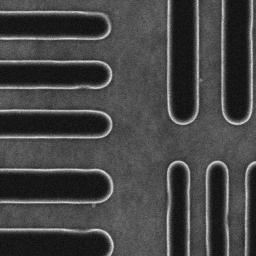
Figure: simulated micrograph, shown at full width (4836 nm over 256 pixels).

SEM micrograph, groups of lines, slits or small figures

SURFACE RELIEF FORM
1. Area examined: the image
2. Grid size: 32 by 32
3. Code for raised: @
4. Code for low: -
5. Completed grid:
---------------------@@@@---@@@-
@@@@@@@@@@-----------@@@@---@@@-
@@@@@@@@@@@@@@-------@@@@---@@@-
@@@@@@@@@@@@@@-------@@@@---@@@-
@@@@@@@@@@@@@--------@@@@---@@@-
---------------------@@@@---@@@-
---------------------@@@@---@@@-
---------------------@@@@---@@@-
@@@@@@@@@@@@@@-------@@@@---@@@-
@@@@@@@@@@@@@@-------@@@@---@@@-
@@@@@@@@@@@@@--------@@@@---@@@-
---------------------@@@@---@@@-
---------------------@@@@---@@@-
---------------------@@@@---@@@-
@@@@@@@@@@@@@--------@@@@---@@@-
@@@@@@@@@@@@@@------------------
@@@@@@@@@@@@@@------------------
--------------------------------
--------------------------------
--------------------------------
----------------------@---@@---@
@@@@@@@@@@@@@--------@@@--@@---@
@@@@@@@@@@@@@@-------@@@--@@---@
@@@@@@@@@@@@@@-------@@@--@@---@
@@@@@@@@@@@@@@-------@@@--@@---@
---------------------@@@--@@---@
---------------------@@@--@@---@
---------------------@@@--@@---@
---------------------@@@--@@---@
@@@@@@@@@@@@@@-------@@@--@@@--@
@@@@@@@@@@@@@@-------@@@--@@@--@
@@@@@@@@@@@@@@-------@@@--@@@--@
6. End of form